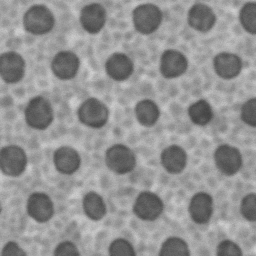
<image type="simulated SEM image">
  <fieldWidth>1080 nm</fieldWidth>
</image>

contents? a regular array of holes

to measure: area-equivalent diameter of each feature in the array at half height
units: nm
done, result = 129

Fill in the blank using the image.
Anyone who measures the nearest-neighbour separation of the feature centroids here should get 53.2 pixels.